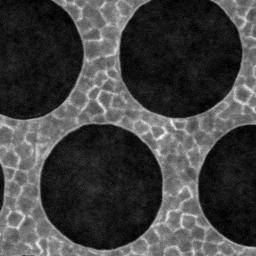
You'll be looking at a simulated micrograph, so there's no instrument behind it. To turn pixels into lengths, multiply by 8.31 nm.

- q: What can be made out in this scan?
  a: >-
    holes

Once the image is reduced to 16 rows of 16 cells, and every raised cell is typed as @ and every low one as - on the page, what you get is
----@@@@@-----@@
-----@@@-------@
-----@@@-------@
-----@@--------@
-----@@@-------@
-----@@@------@@
----@@@@@-----@@
@@@@@@@@@@@@@@@@
@@@@-----@@@@@--
@@@-------@@@---
@@@-------@@@---
@@--------@@----
@@@-------@@----
@@@-------@@@---
@@@@-----@@@@@--
@@@@@@-@@@@@@@@@